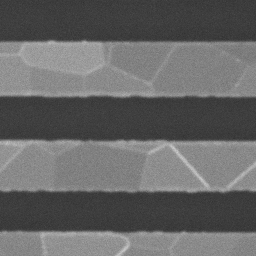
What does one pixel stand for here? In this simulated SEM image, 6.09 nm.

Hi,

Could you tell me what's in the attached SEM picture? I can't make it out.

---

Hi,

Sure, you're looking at lines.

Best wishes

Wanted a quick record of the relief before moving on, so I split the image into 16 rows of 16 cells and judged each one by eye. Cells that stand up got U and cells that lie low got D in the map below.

DDDDDDDDDDDDDDDD
DDDDDDDDDDDDDDDD
DDDDDDDDDDDDDDDD
UUUUUUUUUUUUUUUU
UUUUUUUUUUUUUUUU
UUUUUUUUUUUUUUUU
DDDDDDDDDDDDDDDD
DDDDDDDDDDDDDDDD
DDDDDDDDDDDDDDDD
UUUUUUUUUUUUUUUU
UUUUUUUUUUUUUUUU
UUUUUUUUUUUUUUUU
DDDDDDDDDDDDDDDD
DDDDDDDDDDDDDDDD
UDDDDDDDDDDDDDDD
UUUUUUUUUUUUUUUU